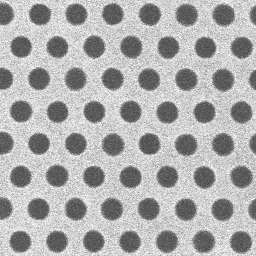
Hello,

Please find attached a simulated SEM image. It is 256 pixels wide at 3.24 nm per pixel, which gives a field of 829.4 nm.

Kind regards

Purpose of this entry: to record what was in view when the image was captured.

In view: a regular array of holes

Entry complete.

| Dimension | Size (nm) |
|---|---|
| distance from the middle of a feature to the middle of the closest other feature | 119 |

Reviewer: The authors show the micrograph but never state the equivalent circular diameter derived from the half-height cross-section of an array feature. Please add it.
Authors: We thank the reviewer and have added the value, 20.8 px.